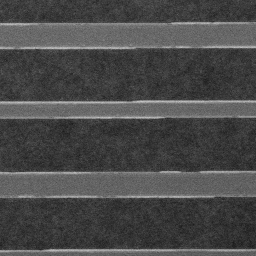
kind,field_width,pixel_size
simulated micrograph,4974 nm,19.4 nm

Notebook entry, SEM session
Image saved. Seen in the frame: lines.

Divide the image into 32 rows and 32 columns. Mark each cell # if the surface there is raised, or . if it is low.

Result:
................................
................................
................................
################################
################################
################################
................................
................................
................................
................................
................................
................................
................................
################################
################################
................................
................................
................................
................................
................................
................................
....................###..#######
################################
################################
###################.####........
................................
................................
................................
................................
................................
................................
################################